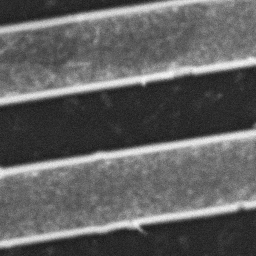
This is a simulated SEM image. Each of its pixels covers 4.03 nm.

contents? one or a few lines or trenches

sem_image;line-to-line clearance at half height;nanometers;281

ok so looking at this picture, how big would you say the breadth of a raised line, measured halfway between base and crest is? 71.7 pixels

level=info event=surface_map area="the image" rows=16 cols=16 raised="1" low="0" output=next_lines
0000000011111111
0011111111111111
1111111111111111
1111111111111111
1111111111100000
1111100000000000
0000000000000000
0000000000000000
0000000000000011
0000000011111111
0011111111111111
1111111111111111
1111111111111111
1111111111100000
1111100000000000
0000000000000000